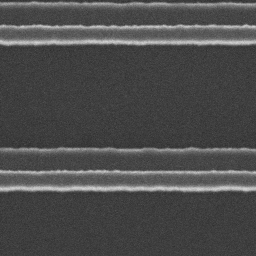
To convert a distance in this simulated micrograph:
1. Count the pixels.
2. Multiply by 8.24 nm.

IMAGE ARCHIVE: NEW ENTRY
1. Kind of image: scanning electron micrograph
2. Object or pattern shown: lines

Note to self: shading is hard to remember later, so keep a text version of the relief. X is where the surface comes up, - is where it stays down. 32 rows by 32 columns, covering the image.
XXXXXXXXXXXXXXXXXXXXXXXXXXXXXXXX
XXXXXXXXXXXXXXXXXXXXXXXXXXXXXXXX
XXXXXXXXXXXXXXXXXXXXXXXXXXXXXXXX
XXXXXXXXXXXXXXXXXXXXXXXXXXXXXXXX
XXXXXXXXXXXXXXXXXXXXXXXXXXXXXXXX
--------------------------------
--------------------------------
--------------------------------
--------------------------------
--------------------------------
--------------------------------
--------------------------------
--------------------------------
--------------------------------
--------------------------------
--------------------------------
--------------------------------
--------------------------------
--------------------------------
XXXXXXXXXXXXXXXXXXXXXXXXXXXXXXXX
XXXXXXXXXXXXXXXXXXXXXXXXXXXXXXXX
XXXXXXXXXXXXXXXXXXXXXXXXXXXXXXXX
XXXXXXXXXXXXXXXXXXXXXXXXXXXXXXXX
X------X--------------XXXXX---X-
--------------------------------
--------------------------------
--------------------------------
--------------------------------
--------------------------------
--------------------------------
--------------------------------
--------------------------------